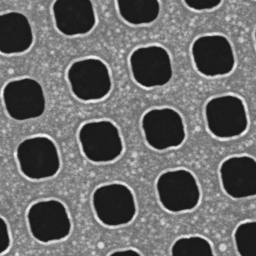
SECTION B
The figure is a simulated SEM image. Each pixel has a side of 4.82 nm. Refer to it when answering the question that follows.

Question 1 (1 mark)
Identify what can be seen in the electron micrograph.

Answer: a regular array of holes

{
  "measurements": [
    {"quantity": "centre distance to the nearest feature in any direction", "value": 304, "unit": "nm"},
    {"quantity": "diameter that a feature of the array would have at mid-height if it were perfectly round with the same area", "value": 203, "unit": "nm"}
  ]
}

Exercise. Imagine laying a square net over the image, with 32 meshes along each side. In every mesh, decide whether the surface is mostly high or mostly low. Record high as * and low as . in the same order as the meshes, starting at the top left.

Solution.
*******....****.....***....*****
*******.....***.....************
...****.....****...*************
....***....*********************
....**********************..****
....********************.....***
...**************....***.....***
***********.****.....***.....***
*********....***.....****....***
*********.....***....***********
*....****.....****...***********
.....****....*******************
*.....********************....**
*.....********************.....*
*....*************....****.....*
***********...****.....***.....*
**********.....***.....***....**
***...****.....***.....*********
**.....***.....****..***********
**.....****....*****************
**.....*********************....
***....**************..*****....
********************....****....
************....****.....***....
************.....***.....****..*
****....****.....***.....*******
****....****.....***************
****.....****...****************
.***.....*********************..
.***....*********************...
.*********************....****..
***************..*****....****..